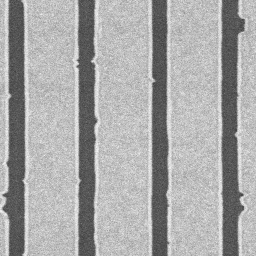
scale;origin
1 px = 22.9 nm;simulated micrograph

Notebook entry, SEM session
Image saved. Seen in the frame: one or a few lines or trenches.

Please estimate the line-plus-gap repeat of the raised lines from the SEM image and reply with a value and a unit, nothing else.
1640 nanometres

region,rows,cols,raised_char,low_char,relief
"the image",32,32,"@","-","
@--@@@@@@---@@@@@@@--@@@@@@---@@
@--@@@@@@@--@@@@@@@--@@@@@@---@@
@--@@@@@@@--@@@@@@@--@@@@@@----@
@--@@@@@@---@@@@@@@--@@@@@@----@
@--@@@@@@---@@@@@@@--@@@@@@---@@
@--@@@@@@---@@@@@@@--@@@@@@---@@
@--@@@@@@---@@@@@@@--@@@@@@---@@
@--@@@@@@---@@@@@@@--@@@@@@---@@
@--@@@@@@---@@@@@@@--@@@@@@---@@
@--@@@@@@@--@@@@@@@--@@@@@@---@@
@--@@@@@@@--@@@@@@@--@@@@@@---@@
@--@@@@@@@--@@@@@@@--@@@@@@---@@
@--@@@@@@@--@@@@@@@--@@@@@@---@@
@--@@@@@@@--@@@@@@@--@@@@@@---@@
@--@@@@@@@--@@@@@@@--@@@@@@---@@
@--@@@@@@@--@@@@@@@--@@@@@@---@@
@--@@@@@@@--@@@@@@@--@@@@@@---@@
@--@@@@@@@--@@@@@@@--@@@@@@---@@
@--@@@@@@@--@@@@@@@--@@@@@@---@@
@--@@@@@@@--@@@@@@@--@@@@@@---@@
@--@@@@@@@--@@@@@@@--@@@@@@@--@@
@--@@@@@@@--@@@@@@@--@@@@@@@--@@
@--@@@@@@@--@@@@@@@--@@@@@@@--@@
@--@@@@@@@--@@@@@@@--@@@@@@@--@@
---@@@@@@---@@@@@@@--@@@@@@@---@
---@@@@@@---@@@@@@@--@@@@@@@---@
---@@@@@@---@@@@@@@--@@@@@@@---@
@--@@@@@@---@@@@@@@--@@@@@@@--@@
@--@@@@@@---@@@@@@@--@@@@@@@--@@
@--@@@@@@---@@@@@@@--@@@@@@@--@@
@--@@@@@@---@@@@@@@--@@@@@@@--@@
@--@@@@@@---@@@@@@@--@@@@@@@--@@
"